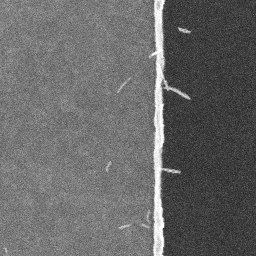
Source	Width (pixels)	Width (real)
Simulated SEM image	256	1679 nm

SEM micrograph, one or a few lines or trenches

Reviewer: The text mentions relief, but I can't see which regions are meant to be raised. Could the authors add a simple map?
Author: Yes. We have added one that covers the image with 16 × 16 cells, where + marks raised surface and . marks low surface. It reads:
..........++++++
..........++++++
..........++++++
..........++++++
..........++++++
..........++++++
..........++++++
..........++++++
..........++++++
..........++++++
..........++++++
..........++++++
..........++++++
..........++++++
..........++++++
..........++++++